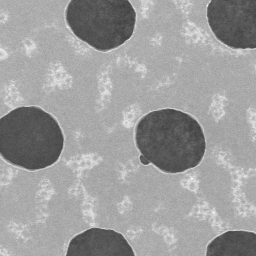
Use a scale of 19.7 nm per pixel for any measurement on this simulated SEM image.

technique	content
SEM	holes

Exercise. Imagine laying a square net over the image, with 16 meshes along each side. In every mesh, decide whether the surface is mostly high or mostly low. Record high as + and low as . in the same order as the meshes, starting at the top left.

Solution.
++++....+++++...
++++....+++++...
+++++...++++++..
++++++++++++++++
++++++++++++++++
++++++++++++++++
++++++++++++++++
...++++++...++++
....++++.....+++
....+++++....+++
+..+++++++..++++
++++++++++++++++
++++++++++++++++
++++++++++++++++
+++++..+++++++.+
++++....+++++...